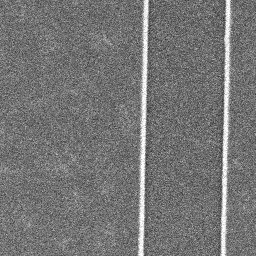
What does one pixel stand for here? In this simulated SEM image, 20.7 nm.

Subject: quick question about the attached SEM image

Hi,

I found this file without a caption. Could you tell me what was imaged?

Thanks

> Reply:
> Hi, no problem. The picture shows one or a few lines or trenches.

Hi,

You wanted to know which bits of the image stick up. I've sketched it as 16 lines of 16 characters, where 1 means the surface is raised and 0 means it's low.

1111111110000011
1111111110000011
1111111110000011
1111111110000011
1111111110000011
1111111110000011
1111111110000011
1111111110000011
1111111110000011
1111111110000011
1111111110000011
1111111110000011
1111111110000011
1111111110000011
1111111110000011
1111111110000011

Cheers